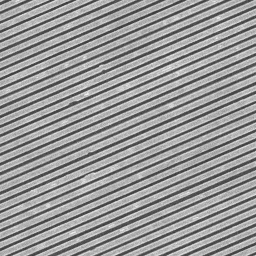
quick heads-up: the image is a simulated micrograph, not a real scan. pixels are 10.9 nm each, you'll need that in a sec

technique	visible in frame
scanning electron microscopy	parallel lines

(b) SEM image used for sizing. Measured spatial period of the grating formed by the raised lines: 94.6 nm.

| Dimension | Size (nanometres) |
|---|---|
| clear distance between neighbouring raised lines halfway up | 31.2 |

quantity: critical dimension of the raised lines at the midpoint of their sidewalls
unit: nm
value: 61.2